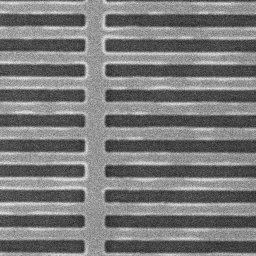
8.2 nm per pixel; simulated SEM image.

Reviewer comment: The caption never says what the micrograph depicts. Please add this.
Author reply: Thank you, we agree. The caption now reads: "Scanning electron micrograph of groups of lines, slits or small figures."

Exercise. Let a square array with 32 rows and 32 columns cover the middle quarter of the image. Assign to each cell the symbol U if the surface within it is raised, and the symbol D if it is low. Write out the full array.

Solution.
DDDDDUUUUUDDDDDDDDDDDDDDDDDDDDDD
DDDDDDUUUUDDDDDDDDDDDDDDDDDDDDDD
DDDDDDUUUUDDDDDDDDDDDDDDDDDDDDDD
UUUDDUUUUUUUDDDUUUUUUUDDDUUUUUUD
UUUUUUUUUUUUUUUUUUUUUUUUUUUUUUUU
UUUUUUUUUUUUUUUUUUUUUUUUUUUUUUUU
DDDDDUUUUUDDDDDDDDDDDDDDDDDDDDDD
DDDDDDUUUUDDDDDDDDDDDDDDDDDDDDDD
DDDDDUUUUUDDDDDDDDDDDDDDDDDDDDDD
DDDDDUUUUUUDDDDDDDDDDDDDDDDDDDDD
UUUUUUUUUUUUUUUUUUUUUUUUUUUUUUUU
UUUUUUUUUUUUUUUUUUUUUUUUUUUUUUUU
DDDDDUUUUUUDDDDDDDDDDDDDDDDDUUDD
DDDDDUUUUUDDDDDDDDDDDDDDDDDDDDDD
DDDDDUUUUUDDDDDDDDDDDDDDDDDDDDDD
DDDDDUUUUUDDDDDDDDDDDDDDDDDDDDDD
UUUUUUUUUUUUUUUUUUUUUUUUUUUUUUUU
UUUUUUUUUUUUUUUUUUUUUUUUUUUUUUUU
UUUUUUUUUUUUUUUUUUUUUUUUUUUUUUUU
DDDDDUUUUUDDDDDDDDDDDDDDDDDDDDDD
DDDDDDUUUUDDDDDDDDDDDDDDDDDDDDDD
DDDDDDUUUUDDDDDDDDDDDDDDDDDDDDDD
UUUUUUUUUUUUUUUUUUUUUUUUUUUUUUUU
UUUUUUUUUUUUUUUUUUUUUUUUUUUUUUUU
UUUUUUUUUUUUUUUUUUUUUUUUUUUUUUUU
DDDDDUUUUUDDDDDDDDDDDDDDDDDDDDDD
DDDDDDUUUUDDDDDDDDDDDDDDDDDDDDDD
DDDDDDUUUUDDDDDDDDDDDDDDDDDDDDDD
DDDDDUUUUUUDDDDDDDDDDDDDDDDDDDDD
UUUUUUUUUUUUUUUUUUUUUUUUUUUUUUUU
UUUUUUUUUUUUUUUUUUUUUUUUUUUUUUUU
DDDDDUUUUUDDDDDDDDDDDDDDDDDDDDDD